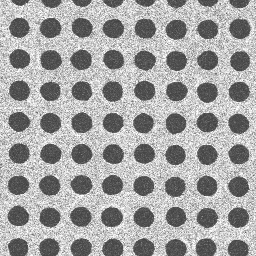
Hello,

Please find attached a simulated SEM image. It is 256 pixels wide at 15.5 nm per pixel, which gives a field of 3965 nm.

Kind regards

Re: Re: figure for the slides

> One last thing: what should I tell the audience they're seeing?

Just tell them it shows a regular array of holes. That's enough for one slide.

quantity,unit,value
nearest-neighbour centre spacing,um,0.479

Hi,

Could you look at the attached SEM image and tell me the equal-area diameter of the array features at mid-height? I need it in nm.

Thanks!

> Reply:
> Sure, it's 318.